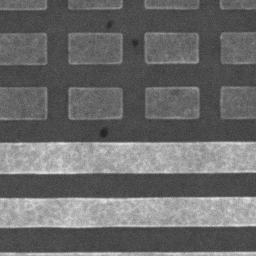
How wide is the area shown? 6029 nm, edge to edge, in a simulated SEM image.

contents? wiring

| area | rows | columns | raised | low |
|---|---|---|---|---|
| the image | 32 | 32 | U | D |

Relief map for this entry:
UUUUUUDDDUUUUUUDDDUUUUUUUDDDUUUU
DDDDDDDDDDDDDDDDDDDDDDDDDDDDDDDD
DDDDDDDDDDDDDDDDDDDDDDDDDDDDDDDD
DDDDDDDDDDDDDDDDDDDDDDDDDDDDDDDD
UUUUUUDDDUUUUUUDDDUUUUUUUDDDUUUU
UUUUUUDDDUUUUUUDDDUUUUUUUDDDUUUU
UUUUUUDDDUUUUUUDDDUUUUUUUDDDUUUU
UUUUUUDDDUUUUUUDDDUUUUUUUDDDUUUU
DDDDDDDDDDDDDDDDDDDDDDDDDDDDDDDD
DDDDDDDDDDDDDDDDDDDDDDDDDDDDDDDD
DDDDDDDDDDDDDDDDDDDDDDDDDDDDDDDD
UUUUUUDDDUUUUUUDDDUUUUUUUDDDUUUU
UUUUUUDDDUUUUUUDDDUUUUUUUDDDUUUU
UUUUUUDDDUUUUUUDDDUUUUUUUDDDUUUU
UUUUUUDDDUUUUUUDDDUUUUUUUDDDUUUU
DDDDDDDDDDDDDDDDDDDDDDDDDDDDDDDD
DDDDDDDDDDDDDDDDDDDDDDDDDDDDDDDD
DDDDDDDDDDDDDDDDDDDDDDDDDDDDDDDD
UUUUUUUUUUUUUUUUUUUUUUUUUUUUUUUU
UUUUUUUUUUUUUUUUUUUUUUUUUUUUUUUU
UUUUUUUUUUUUUUUUUUUUUUUUUUUUUUUU
UUUUUUUUUUUUUUUUUUUUUUUUUUUUUUDD
DDDDDDDDDDDDDDDDDDDDDDDDDDDDDDDD
DDDDDDDDDDDDDDDDDDDDDDDDDDDDDDDD
DDDDDDDDDDDDDDDDDDDDDDDDDDDDDDDD
UUUUUUUUUUUUUUUUUUUUUUUUUUUUUUUU
UUUUUUUUUUUUUUUUUUUUUUUUUUUUUUUU
UUUUUUUUUUUUUUUUUUUUUUUUUUUUUUUU
DDDDDDDDDDDDDDDDDDDDDDDDDDDDDDDD
DDDDDDDDDDDDDDDDDDDDDDDDDDDDDDDD
DDDDDDDDDDDDDDDDDDDDDDDDDDDDDDDD
DDDDDDDDDDDDDDDDDDDDDDDDDDDDDDDD